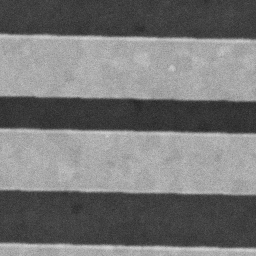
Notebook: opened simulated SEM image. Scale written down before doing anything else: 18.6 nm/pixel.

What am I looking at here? lines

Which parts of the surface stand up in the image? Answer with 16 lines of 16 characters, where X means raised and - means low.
----------------
----------------
XXXXXXXXXXXXXX--
XXXXXXXXXXXXXXXX
XXXXXXXXXXXXXXXX
XXXXXXXXXXXXXXXX
----------------
----------------
XXXXXXXXXXXXXXXX
XXXXXXXXXXXXXXXX
XXXXXXXXXXXXXXXX
XXXXXXXXXXXXXXXX
----------------
----------------
----------------
XXXXXXXXXXXX----